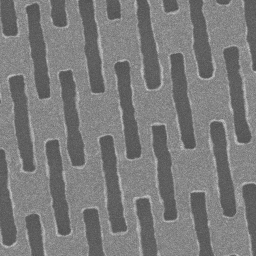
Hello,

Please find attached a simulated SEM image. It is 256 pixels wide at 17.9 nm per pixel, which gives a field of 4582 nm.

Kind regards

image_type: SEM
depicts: a regular array of holes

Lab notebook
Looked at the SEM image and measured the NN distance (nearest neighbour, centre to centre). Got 0.982 microns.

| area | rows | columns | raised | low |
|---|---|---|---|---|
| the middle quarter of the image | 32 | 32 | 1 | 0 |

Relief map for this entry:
11111100011110001110000011100011
10111100011110000111000011100011
00111100011110000111000001100011
00111100001110000111000011100001
00011100001110000111000011100001
00011100001110000111000011100001
00011110001110000111101111100001
00001111111111000111111111100001
00001111111111000111111111100001
00011111111111000111111111100001
00011111111111000111111111110000
00001111111111100011111111110000
00001111111111100011111111110000
00001111111111100011111111110000
00001111111111100011111111111000
00001111111111100001110001111000
00001111111111100001110001111000
00001111111111100001110000111000
10000111100011100001110000111000
10000111100001100001110000111100
10000111100011100001110000111100
10000111100001100001110000111111
10000111100001110001111000011111
11000011100001110001111000011111
11000111100001111111111000011111
11000111100001111111111000011111
11111111100001111111111000011111
11111111110000111111111000011111
11111111110000111111111000011111
11111111110000111111111000001111
11111111110000111111111000001111
11111111110000111111111000001111